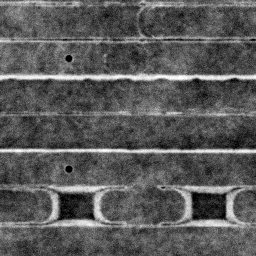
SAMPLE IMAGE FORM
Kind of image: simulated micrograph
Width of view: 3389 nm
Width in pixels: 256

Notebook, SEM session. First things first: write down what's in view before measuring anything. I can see wiring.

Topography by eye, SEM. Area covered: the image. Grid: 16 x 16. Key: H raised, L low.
HHHHHHHHHHHHHHHH
HHHHHHHHHHHHHHHH
HHHHHHHHHHHHHHHH
HHHHHHHHHHHHHHHH
HHHHHHHHHHHHHHHH
LLLLLLLLLLLLLLLL
LLLLLLLLLLLLLLLL
LLLLLLLLLLLLLLLL
LLLLLLLLLLLLLLLL
HHHHHHHHHHHHHHHH
HHHHHHHHHHHHHHHH
HHHHHHHHHHHHHHHH
HHHLLLHHHHHHLLHH
HHHLLLHHHHHHLLHH
HHHHHHHHHHHHHHHH
HHHHHHHHHHHHHHHH